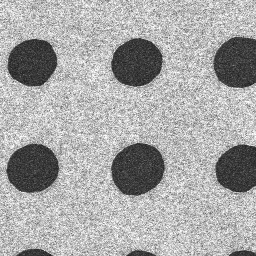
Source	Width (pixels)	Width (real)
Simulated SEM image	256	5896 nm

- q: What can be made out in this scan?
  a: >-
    holes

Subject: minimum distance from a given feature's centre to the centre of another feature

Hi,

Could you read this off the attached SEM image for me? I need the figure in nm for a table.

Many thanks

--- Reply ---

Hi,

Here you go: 2410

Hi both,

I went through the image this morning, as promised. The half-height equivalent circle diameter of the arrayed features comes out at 1150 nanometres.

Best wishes